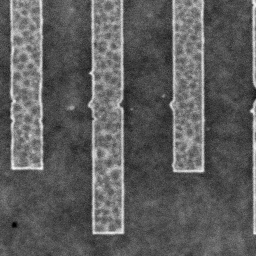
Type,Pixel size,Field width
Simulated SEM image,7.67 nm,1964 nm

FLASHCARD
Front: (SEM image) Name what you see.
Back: one or a few lines or trenches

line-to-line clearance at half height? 395 nanometers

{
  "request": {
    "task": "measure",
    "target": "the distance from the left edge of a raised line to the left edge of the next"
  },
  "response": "621 nm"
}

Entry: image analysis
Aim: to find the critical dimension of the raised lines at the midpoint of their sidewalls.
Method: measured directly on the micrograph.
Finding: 224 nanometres